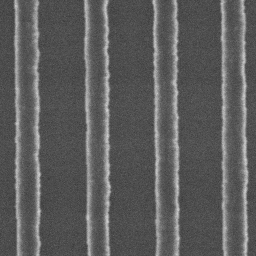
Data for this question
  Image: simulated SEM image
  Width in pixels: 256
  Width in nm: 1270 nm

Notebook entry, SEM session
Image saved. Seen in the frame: lines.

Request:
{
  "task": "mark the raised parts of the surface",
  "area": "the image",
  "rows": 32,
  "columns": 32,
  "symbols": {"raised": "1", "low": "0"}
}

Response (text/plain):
00111000000110000001110000001100
00110000000110000001110000001100
00110000000110000001110000001110
00111000000110000001110000001110
00111000000110000001110000001100
00111000000110000001110000001110
00111000000110000001110000001110
00111000000110000001110000001110
00111000000110000001110000001100
00111000000111000001110000001110
00111000000110000001110000001110
00111000000111000001110000001110
00111000000110000000110000001110
00111000000110000000110000001110
00111000000110000001110000001110
00111000000110000001110000001110
00111000000111000001110000001110
00111000000110000000110000001110
00111000000110000000110000001110
00111000000110000000110000001110
00111000000111000000110000001110
00111000000111000000110000001110
00111000000110000000110000001110
00111000000111000000110000001110
00111000000111000000110000001110
00111000000111000000110000001110
00111000000110000000110000001110
00111000000110000000110000001110
00111000000110000000110000001110
00111000000110000000110000001110
00111000000111000000110000001110
00111000000111000000110000001110